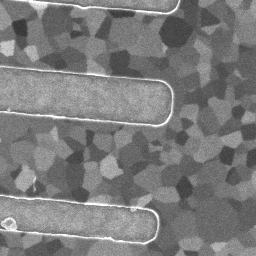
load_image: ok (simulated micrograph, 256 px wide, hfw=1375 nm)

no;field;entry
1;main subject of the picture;one or a few lines or trenches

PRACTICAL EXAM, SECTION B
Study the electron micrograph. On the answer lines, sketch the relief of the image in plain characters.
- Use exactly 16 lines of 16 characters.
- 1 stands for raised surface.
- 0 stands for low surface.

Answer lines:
1111111000011111
1111111111111111
1111111111111111
1111111111111111
0000111111111111
0000000000011111
0000000000011111
1111110000111111
1111111111111111
1111111111111111
1111111111111111
1111111111111111
0001111111111111
0000000000111111
1100000000111111
1111111111111111